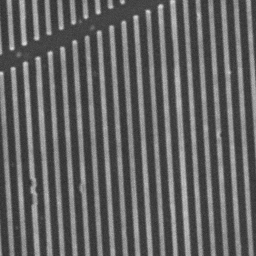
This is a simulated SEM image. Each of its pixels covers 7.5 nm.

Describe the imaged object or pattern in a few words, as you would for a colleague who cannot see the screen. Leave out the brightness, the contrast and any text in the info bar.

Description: parallel lines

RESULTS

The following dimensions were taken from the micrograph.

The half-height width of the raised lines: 3.75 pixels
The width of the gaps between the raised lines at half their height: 0.0711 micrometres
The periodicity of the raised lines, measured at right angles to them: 0.0942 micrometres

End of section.